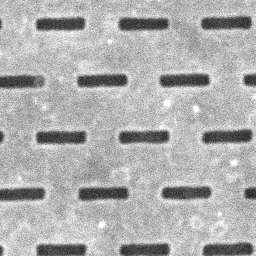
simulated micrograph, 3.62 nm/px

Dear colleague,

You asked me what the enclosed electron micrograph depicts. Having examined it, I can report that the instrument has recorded a regular array of holes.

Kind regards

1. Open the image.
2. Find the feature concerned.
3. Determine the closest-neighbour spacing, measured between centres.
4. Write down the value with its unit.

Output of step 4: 252 nanometers